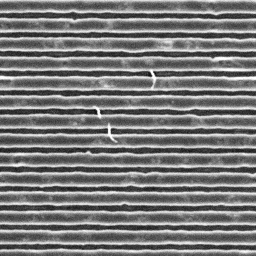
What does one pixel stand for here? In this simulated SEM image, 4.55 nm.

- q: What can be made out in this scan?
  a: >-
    parallel lines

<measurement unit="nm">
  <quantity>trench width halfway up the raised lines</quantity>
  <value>26.8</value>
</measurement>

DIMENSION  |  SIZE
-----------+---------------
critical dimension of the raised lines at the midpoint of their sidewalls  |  0.0626 µm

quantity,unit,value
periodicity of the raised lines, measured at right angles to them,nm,87.7